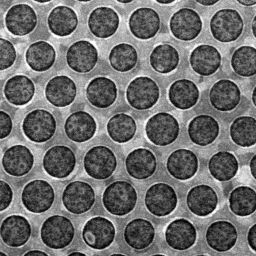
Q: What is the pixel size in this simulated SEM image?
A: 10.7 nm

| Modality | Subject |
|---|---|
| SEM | a regular array of holes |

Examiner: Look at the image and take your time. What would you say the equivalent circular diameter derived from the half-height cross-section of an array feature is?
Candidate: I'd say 341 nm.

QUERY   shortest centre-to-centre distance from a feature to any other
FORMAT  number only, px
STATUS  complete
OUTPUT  40.4